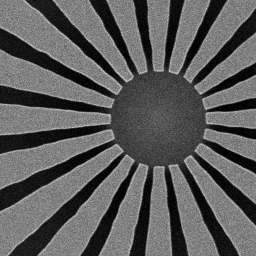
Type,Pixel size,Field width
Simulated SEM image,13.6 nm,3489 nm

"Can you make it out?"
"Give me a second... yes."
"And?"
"groups of lines, slits or small figures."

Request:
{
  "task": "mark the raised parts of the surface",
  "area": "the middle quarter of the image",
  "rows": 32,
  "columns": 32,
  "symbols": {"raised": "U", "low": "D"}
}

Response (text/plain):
UUUUUUUUUDDDUUUUDDUUUDUUUDDUUUDU
DDUUUUUUUUDDDUUUDDUUUDDUUDUUUDDU
DDDDDUUUUUUDDUUUUDDDDDDDDDDDDDUU
DDDDDDUUUUUUDDUUUDDDDDDDDDDDDDUU
UUDDDDDDUUUUUDDDDDDDDDDDDDDDDDDD
UUUUDDDDDUUUUUDDDDDDDDDDDDDDDDDD
UUUUUUUDDDDUUUDDDDDDDDDDDDDDDDDD
UUUUUUUUUDDDDDDDDDDDDDDDDDDDDDDD
UUUUUUUUUUUDDDDDDDDDDDDDDDDDDDDD
DDDDDUUUUUUUDDDDDDDDDDDDDDDDDDDD
DDDDDDDDDDUUDDDDDDDDDDDDDDDDDDDD
DDDDDDDDDDDDDDDDDDDDDDDDDDDDDDDD
UUUUUUUUUUDDDDDDDDDDDDDDDDDDDDDD
UUUUUUUUUUUUDDDDDDDDDDDDDDDDDDDD
UUUUUUUUUUUUDDDDDDDDDDDDDDDDDDDD
UUUUUDDDDDDDDDDDDDDDDDDDDDDDDDDD
DDDDDDDDDDDDDDDDDDDDDDDDDDDDDDDD
DDDDDDDUUUUUDDDDDDDDDDDDDDDDDDDD
DDDUUUUUUUUUDDDDDDDDDDDDDDDDDDDD
UUUUUUUUUUUDDDDDDDDDDDDDDDDDDDDD
UUUUUUUUDDDDUUDDDDDDDDDDDDDDDDDD
UUUUUUDDDDDUUUUDDDDDDDDDDDDDDDDD
UUUUDDDDDUUUUUDDDDDDDDDDDDDDDDDD
UDDDDDDUUUUUUDDUUDDDDDDDDDDDDDDU
DDDDDDUUUUUUDDUUUDDDDDDDDDDDDDUU
DDDDUUUUUUUDDUUUUDDUUDDDDDUUDDDU
DDUUUUUUUUDDUUUUDDUUUDUUUDDUUDDU
DUUUUUUUUDDDUUUUDDUUUDUUUDDUUUDD
UUUUUUUDDDDUUUUDDUUUDDUUUDDUUUDD
UUUUUUDDDDUUUUDDDUUUDDUUUDDUUUUD
UUUUUDDDDUUUUUDDUUUUDDUUUDDUUUUD
UUUUDDDDUUUUUDDDUUUUDDUUUUDDUUUU